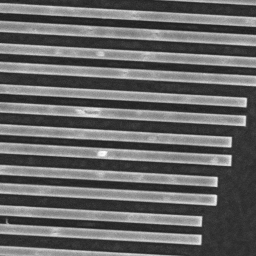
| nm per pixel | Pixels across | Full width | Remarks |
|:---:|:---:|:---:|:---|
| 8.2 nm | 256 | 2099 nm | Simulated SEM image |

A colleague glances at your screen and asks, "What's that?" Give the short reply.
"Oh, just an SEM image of parallel lines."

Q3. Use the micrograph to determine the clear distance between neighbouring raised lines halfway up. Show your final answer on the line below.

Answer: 95.2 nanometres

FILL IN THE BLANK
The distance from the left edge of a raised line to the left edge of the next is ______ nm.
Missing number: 164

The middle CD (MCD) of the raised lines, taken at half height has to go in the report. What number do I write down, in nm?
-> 80.9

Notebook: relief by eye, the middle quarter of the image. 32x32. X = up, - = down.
XX------------------------------
XXXXXXXXXXXXXXXXXXXX------------
XXXXXXXXXXXXXXXXXXXXXXXXXXXXXXXX
---------------XXXXXXXXXXXXXXXXX
--------------------------------
--------------------------------
XXXXXXXX------------------------
XXXXXXXXXXXXXXXXXXXXXXXXXX------
--------XXXXXXXXXXXXXXXXXXXXXXXX
--------------------------XXXXXX
--------------------------------
XXXXXXXXXXXXXXXXX---------------
XXXXXXXXXXXXXXXXXXXXXXXXXXXXXXXX
-------------XXXXXXXXXXXXXXXXXXX
-------------------------------X
--------------------------------
XXXXXX--------------------------
XXXXXXXXXXXXXXXXXXXXXXXX--------
--XXXXXXXXXXXXXXXXXXXXXXXXXXXXXX
-------------------XXXXXXXXXXXXX
--------------------------------
XXXXXXXXXXXXXXX-----------------
XXXXXXXXXXXXXXXXXXXXXXXXXXXXXXXX
-----------XXXXXXXXXXXXXXXXXXXXX
----------------------------XXXX
--------------------------------
XXXX----------------------------
XXXXXXXXXXXXXXXXXXXXXX----------
XXXXXXXXXXXXXXXXXXXXXXXXXXXXXXXX
-----------------XXXXXXXXXXXXXXX
--------------------------------
XXXXXXXXXXXXX-------------------